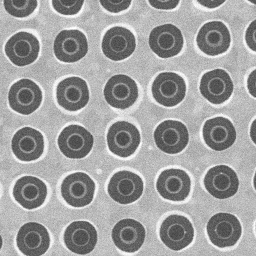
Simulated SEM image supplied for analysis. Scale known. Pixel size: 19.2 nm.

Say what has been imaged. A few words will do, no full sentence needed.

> an array of small figures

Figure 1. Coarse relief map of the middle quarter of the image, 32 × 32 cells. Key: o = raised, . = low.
oooooooooooooooooooooooooooooooo
oooooooooooooooooooooooooooooooo
ooooooooooooooooooooooo......ooo
....ooooooo......oooooo.......oo
......ooooo.......oooo...oo....o
......oooo...ooo...ooo..oooo...o
.oo...oooo..oooo...oo...oooo...o
.ooo...ooo..oooo...ooo...ooo..oo
.ooo..oooo...oo....ooo........oo
......ooooo.......ooooo......ooo
.....ooooooo......ooooooo...oooo
....ooooooooo...oooooooooooooooo
oooooooooooooooooooooooooooooooo
oooooooooooooooooooooooooooooooo
oooooooooooo.....ooooooo......oo
o....oooooo.......ooooo........o
......ooooo........oooo...o....o
.......oooo..ooo...ooo...ooo...o
.oooo..ooo...oooo..ooo...ooo...o
.oooo..oooo..ooo...oooo..ooo...o
.oooo..oooo...o....oooo........o
.......oooo.......oooooo......oo
......oooooo......oooooooo..oooo
o....ooooooooo..oooooooooooooooo
oooooooooooooooooooooooooooooooo
oooooooooooooooooooooooooooooooo
ooooooooooooo....oooooooo.....oo
o.....oooooo.......ooooo.......o
.......oooo.........ooo....o....
........ooo...ooo...ooo...ooo...
..ooo...oo....ooo...ooo...ooo...
..ooo...ooo...ooo...ooo...ooo...